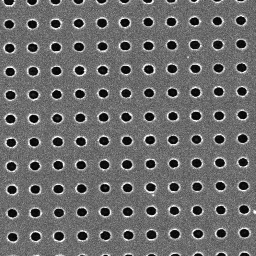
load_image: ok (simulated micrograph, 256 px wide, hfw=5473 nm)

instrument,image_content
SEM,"a regular array of holes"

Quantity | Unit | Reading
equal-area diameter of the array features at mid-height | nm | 198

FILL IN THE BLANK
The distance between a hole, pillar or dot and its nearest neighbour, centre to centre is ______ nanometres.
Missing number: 493